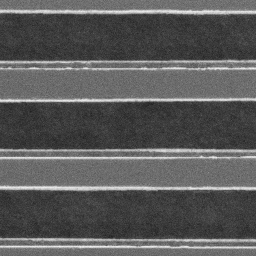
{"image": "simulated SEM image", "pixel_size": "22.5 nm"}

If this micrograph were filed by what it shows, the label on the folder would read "lines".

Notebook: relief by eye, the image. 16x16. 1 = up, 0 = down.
1111111111111111
0000000000000000
0000000000000000
0000000000000000
1111111111111111
1111111111111111
0000000000000000
0000000000000000
0000000000000000
1111111111111111
1111111111111111
1111111111111111
0000000000000000
0000000000000000
0000000000000000
1111111111111111